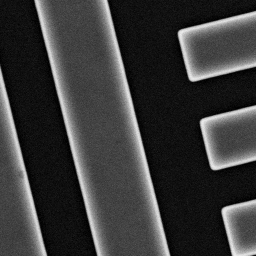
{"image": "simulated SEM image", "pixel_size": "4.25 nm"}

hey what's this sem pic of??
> groups of lines, slits or small figures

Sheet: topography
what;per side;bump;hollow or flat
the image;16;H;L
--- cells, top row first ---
LLHHHHHLLLLLLLLL
LLLHHHHLLLLLLHHH
LLLHHHHLLLLHHHHH
LLLHHHHLLLLHHHHH
LLLHHHHHLLLLHHLL
LLLLHHHHLLLLLLLL
HLLLHHHHLLLLLLLL
HLLLHHHHLLLLLHHH
HLLLHHHHHLLLLHHH
HLLLLHHHHLLLLHHH
HHLLLHHHHLLLLLLL
HHLLLHHHHLLLLLLL
HHLLLHHHHHLLLLLL
HHLLLLHHHHLLLLHH
HHHLLLHHHHLLLLHH
HHHLLLHHHHLLLLHH